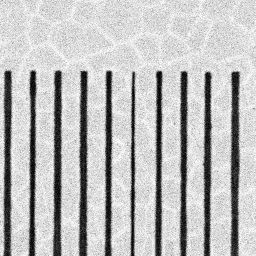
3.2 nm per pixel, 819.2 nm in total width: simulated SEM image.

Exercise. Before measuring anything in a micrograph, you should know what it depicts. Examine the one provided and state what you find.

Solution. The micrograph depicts parallel lines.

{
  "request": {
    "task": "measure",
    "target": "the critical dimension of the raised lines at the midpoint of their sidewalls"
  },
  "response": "60.1 nm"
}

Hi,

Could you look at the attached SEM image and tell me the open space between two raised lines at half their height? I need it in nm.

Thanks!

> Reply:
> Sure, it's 20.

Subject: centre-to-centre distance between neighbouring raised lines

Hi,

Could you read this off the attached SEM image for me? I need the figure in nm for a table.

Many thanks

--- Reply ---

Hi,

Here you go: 80.3